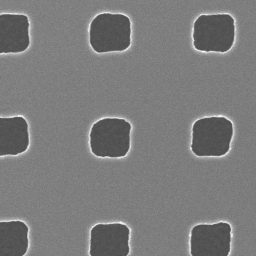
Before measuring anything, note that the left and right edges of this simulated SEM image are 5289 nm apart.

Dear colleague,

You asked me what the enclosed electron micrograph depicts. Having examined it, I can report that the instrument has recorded holes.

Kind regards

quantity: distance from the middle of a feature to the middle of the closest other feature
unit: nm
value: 2120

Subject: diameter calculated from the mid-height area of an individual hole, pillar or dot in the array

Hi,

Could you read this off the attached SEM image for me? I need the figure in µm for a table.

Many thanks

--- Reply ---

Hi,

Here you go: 0.868